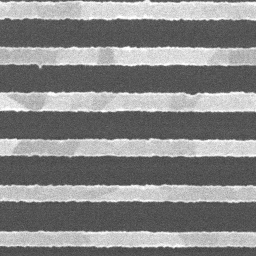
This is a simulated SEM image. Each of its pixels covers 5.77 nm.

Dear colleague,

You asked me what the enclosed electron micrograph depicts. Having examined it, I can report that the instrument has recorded parallel lines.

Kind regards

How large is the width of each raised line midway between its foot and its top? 90.9 nanometers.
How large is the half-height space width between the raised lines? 171 nanometers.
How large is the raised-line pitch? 264 nanometres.